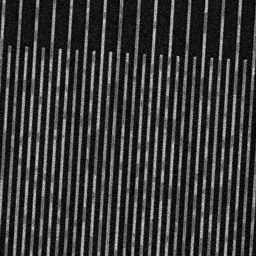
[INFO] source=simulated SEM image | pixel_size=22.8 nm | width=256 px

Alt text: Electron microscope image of parallel lines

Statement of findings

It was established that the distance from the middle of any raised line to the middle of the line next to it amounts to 192 nm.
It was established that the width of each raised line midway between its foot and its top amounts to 48.4 nm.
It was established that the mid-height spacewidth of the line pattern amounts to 142 nanometres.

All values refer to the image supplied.